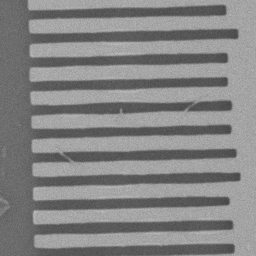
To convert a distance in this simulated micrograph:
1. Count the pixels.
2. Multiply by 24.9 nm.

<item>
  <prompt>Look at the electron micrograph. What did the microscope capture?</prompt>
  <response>groups of lines, slits or small figures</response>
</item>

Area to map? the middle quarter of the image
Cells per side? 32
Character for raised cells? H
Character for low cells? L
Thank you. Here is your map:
LLLLLLLLLLLLLLLHHHHHHHHHHHHHHHHH
HHHHHHHHHHHHHHHHHHHHHHHHHHHHHHHH
HHHHHHHHHHHHHHHHHHHHHHHHHHHHHHHH
HHHHHHHHHHHHHHHHHHHHHHHHHLLLLLLL
LLLLLLLLLLLLLLLLLLLLLLLLLLLLLLLL
LLLLLLLLLLLLLLLLLLLLLLLLLLLLLLLL
LLLLLLLLLLLLLLLLLLLHHHHHHHHHHHHH
HHHHHHHHHHHHHHHHHHHHHHHHHHHHHHHH
HHHHHHHHHHHHHHHHHHHHHHHHHHHHHHHH
HHHHHHHHHHLLLLLLLLLLLLHHHHHHLLLL
LLLLLLLLLLLLLLLLLLLLLLLLLLLLLLLL
LLLLLLLLLLLLLLLLLLLLLLLLLLLLLLHL
LLLLLLLLLLLLLLHLLLHHHHHHHHHHHHHH
HHHHHHHHHHHHHHHHHHHHHHHHHHHHHHHH
HHHHHHHHHHHHHHHHHHHHHHHHHHHHHHHH
HHHHHHHHHHHHHHHHHHHHHHHHHLLLLLLL
LLLLLLLLLLLLLLLLLLLLLLLLLLLLLLLL
LLLLLLLLLLLLLLLLLLLLLLLLLLLLLLLL
LLLLLLLLLLLHHHHHHHHHHHHHHHHHHHHH
HHHHHHHHHHHHHHHHHHHHHHHHHHHHHHHH
HHHHHHHHHHHHHHHHHHHHHHHHHHHHHHHH
HHHHHHHHHHHHHHHHHHLLLLLLLLLLLLLL
LLLLLLLLLLLLLLLLLLLLLLLLLLLLLLLL
LLLLLLLLLLLLLLLLLLLLLLLLLLLLLLLL
LHLLLLLLLLLLHHHHHHHHHHHHHHHHHHHH
HHHHHHHHHHHHHHHHHHHHHHHHHHHHHHHH
HHHHHHHHHHHHHHHHHHHHHHHHHHHHHHHH
HHHHHHHLLLLLLLLLLLLLLLLLLLLLLLLL
LLLLLLLLLLLLLLLLLLLLLLLLLLLLLLLL
LLLLLLLLLLLLLLLLLLLLLLLLLLLLLLLL
LLLLLLLLLLLLLLLHHHHHHHHHHHHHHHHH
HHHHHHHHHHHHHHHHHHHHHHHHHHHHHHHH